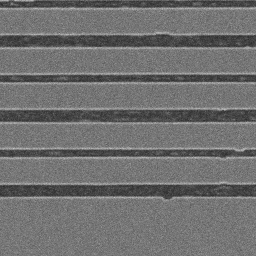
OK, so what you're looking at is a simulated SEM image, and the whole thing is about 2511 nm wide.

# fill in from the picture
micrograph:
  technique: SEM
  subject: parallel lines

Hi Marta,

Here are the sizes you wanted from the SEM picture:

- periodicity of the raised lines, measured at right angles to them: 366 nanometres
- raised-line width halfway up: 259 nm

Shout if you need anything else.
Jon